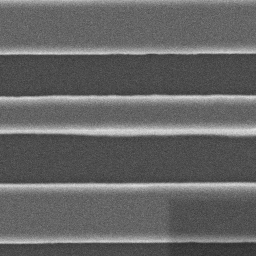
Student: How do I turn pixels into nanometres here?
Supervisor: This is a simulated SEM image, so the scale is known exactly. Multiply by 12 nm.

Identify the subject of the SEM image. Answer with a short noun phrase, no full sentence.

lines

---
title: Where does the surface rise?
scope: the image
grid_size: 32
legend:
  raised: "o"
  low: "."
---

oooooooooooooooooooooooooooooooo
oooooooooooooooooooooooooooooooo
oooooooooooooooooooooooooooooooo
oooooooooooooooooooooooooooooooo
oooooooooooooooooooooooooooooooo
oooooooooooooooooooooooooooooooo
oooooooooooooooooooooooooooooooo
................................
................................
................................
................................
................................
oooooooooooooooooooooooooooooooo
oooooooooooooooooooooooooooooooo
oooooooooooooooooooooooooooooooo
oooooooooooooooooooooooooooooooo
................................
................................
................................
................................
................................
................................
................................
oooooooooooooooooooooooooooooooo
oooooooooooooooooooooooooooooooo
oooooooooooooooooooooooooooooooo
oooooooooooooooooooooooooooooooo
oooooooooooooooooooooooooooooooo
oooooooooooooooooooooooooooooooo
oooooooooooooooooooooooooooooooo
................................
................................